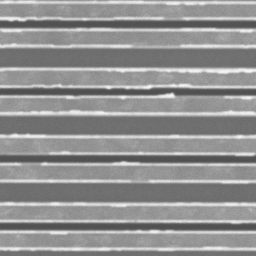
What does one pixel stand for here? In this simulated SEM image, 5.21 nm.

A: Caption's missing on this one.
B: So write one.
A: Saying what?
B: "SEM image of parallel lines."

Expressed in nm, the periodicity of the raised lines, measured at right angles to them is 171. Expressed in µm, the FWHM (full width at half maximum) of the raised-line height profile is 0.102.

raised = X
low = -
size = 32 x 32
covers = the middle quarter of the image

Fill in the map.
--------------------------------
XXXXXXXXXXXXXXXXXXXXXXXXXXXXXXXX
XXXXXXXXXXXXXXXXXXXXXXXXXXXXXXXX
XXXXXXXXXXXXXXXXXXXXXXXXXXXXXXXX
XXXXXXXXXXXXXXXXXXXXXXXXXXXXXXXX
XXXXXXXXXXXXXXXXXXXXXXXXXXXXXXXX
--------------------------------
--------------------------X-----
XXXXXXXXXXXXXXXXXXXXXXXXXXXXXXXX
XXXXXXXXXXXXXXXXXXXXXXXXXXXXXXXX
XXXXXXXXXXXXXXXXXXXXXXXXXXXXXXXX
XXXXXXXXXXXXXXXXXXXXXXXXXXXXXXXX
XXXXXXXXXXXXXXXXXXXXXXXXXXXXXXXX
--------------------------------
--------------------------------
--------------------------------
--------------------------------
--------------------------------
XXXXXXXXXXXXXXXXXXXXXXXXXXXXXXXX
XXXXXXXXXXXXXXXXXXXXXXXXXXXXXXXX
XXXXXXXXXXXXXXXXXXXXXXXXXXXXXXXX
XXXXXXXXXXXXXXXXXXXXXXXXXXXXXXXX
XXXXXXXXXXXXXXXXXXXXXXXXXXXXXXXX
--------------------------------
--------------------------------
XXXXXXXXXXXXXXXXXXXXXXXXXXXXXXXX
XXXXXXXXXXXXXXXXXXXXXXXXXXXXXXXX
XXXXXXXXXXXXXXXXXXXXXXXXXXXXXXXX
XXXXXXXXXXXXXXXXXXXXXXXXXXXXXXXX
----------------------X---------
--------------------------------
--------------------------------